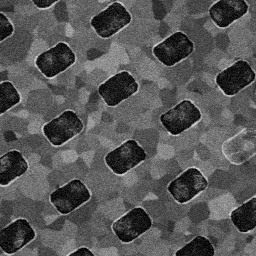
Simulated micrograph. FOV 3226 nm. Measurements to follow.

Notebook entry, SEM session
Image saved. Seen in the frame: a regular array of holes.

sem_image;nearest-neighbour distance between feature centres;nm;857